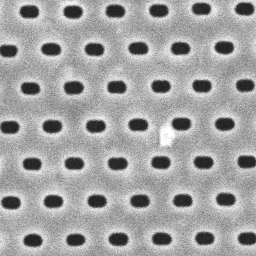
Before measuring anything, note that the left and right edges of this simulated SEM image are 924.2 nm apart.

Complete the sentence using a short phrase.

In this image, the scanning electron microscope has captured a regular array of holes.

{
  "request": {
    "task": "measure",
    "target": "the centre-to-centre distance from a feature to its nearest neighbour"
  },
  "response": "154 nm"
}